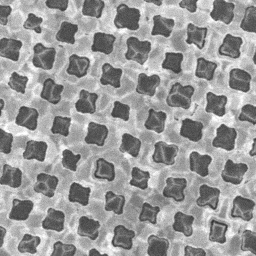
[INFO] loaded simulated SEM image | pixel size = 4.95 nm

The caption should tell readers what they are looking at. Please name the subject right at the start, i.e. a regular array of holes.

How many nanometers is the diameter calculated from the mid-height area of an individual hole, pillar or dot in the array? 114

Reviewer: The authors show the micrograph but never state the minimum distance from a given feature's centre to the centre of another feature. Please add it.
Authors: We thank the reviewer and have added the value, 34.4 pixels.